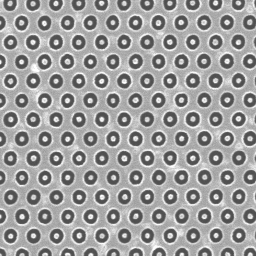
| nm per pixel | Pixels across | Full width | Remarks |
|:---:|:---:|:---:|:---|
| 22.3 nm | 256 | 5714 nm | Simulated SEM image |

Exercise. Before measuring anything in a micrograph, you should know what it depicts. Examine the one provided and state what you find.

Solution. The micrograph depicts a regular array of ring-shaped grooves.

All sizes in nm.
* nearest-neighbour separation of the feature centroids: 497